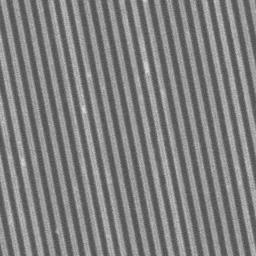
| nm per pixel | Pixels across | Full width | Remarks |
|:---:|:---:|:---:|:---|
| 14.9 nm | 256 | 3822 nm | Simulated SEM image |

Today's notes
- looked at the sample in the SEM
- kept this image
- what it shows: parallel lines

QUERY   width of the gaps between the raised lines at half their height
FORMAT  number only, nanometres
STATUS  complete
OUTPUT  112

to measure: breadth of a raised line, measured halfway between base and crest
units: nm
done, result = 62.3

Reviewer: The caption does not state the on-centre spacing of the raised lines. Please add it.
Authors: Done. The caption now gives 174 nanometers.